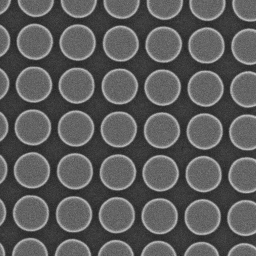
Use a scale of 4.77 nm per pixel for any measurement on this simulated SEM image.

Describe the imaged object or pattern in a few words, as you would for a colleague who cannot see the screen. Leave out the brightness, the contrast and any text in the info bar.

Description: an array of small figures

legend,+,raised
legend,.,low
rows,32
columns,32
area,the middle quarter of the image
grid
................................
.+++++.......+++................
+++++++....++++++.....++++++....
+++++++...++++++++...+++++++....
+++++++...++++++++..+++++++++..+
++++++++..++++++++..+++++++++..+
+++++++...++++++++..+++++++++..+
+++++++...++++++++..+++++++++..+
++++++....+++++++....+++++++...+
.++++.......++++......+++++.....
................................
................................
+++++......+++++.......+++......
++++++....+++++++....++++++.....
+++++++...++++++++...+++++++...+
+++++++..+++++++++..+++++++++..+
+++++++..+++++++++..+++++++++..+
+++++++..+++++++++..+++++++++..+
+++++++...+++++++...++++++++...+
++++++....+++++++....+++++++...+
............+++.......+++++.....
................................
..++............................
++++++.....+++++......+++++.....
++++++....+++++++....+++++++....
+++++++..+++++++++..++++++++...+
+++++++..+++++++++..+++++++++..+
+++++++..+++++++++..+++++++++..+
+++++++..+++++++++..++++++++...+
++++++....+++++++...++++++++...+
+++++.....++++++.....++++++....+
............++........++++......